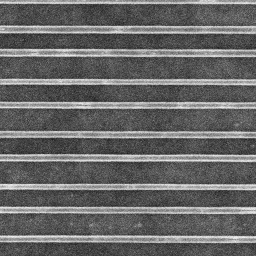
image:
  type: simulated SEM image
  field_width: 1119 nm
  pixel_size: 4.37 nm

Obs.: parallel lines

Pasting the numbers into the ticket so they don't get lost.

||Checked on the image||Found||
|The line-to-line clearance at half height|99.9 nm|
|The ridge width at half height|0.0262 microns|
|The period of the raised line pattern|114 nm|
